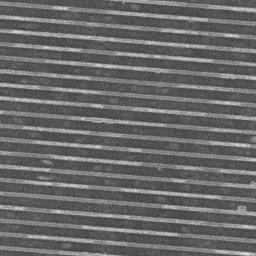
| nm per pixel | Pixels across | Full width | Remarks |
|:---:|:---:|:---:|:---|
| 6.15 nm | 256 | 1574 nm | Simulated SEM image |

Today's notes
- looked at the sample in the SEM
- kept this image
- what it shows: parallel lines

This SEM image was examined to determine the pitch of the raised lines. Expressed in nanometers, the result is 83.2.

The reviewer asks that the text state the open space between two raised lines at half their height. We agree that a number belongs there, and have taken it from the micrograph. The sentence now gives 10.2 px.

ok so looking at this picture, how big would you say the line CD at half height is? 19.2 nanometres